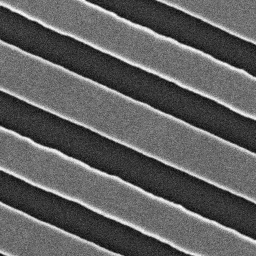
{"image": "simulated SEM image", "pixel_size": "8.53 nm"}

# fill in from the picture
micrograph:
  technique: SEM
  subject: lines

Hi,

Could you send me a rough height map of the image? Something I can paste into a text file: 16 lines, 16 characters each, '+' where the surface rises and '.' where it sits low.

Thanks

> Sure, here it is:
++++++.....+++++
...+++++.....+++
.....++++++....+
++.....++++++...
+++++....++++++.
+++++++.....++++
..+++++++.....++
....+++++++.....
+.....+++++++...
++++.....+++++++
++++++.....+++++
..++++++.....+++
....++++++......
++.....++++++...
++++.....++++++.
++++++.....+++++